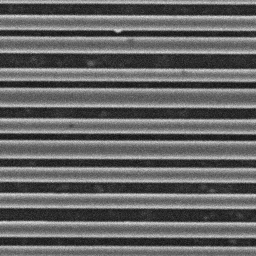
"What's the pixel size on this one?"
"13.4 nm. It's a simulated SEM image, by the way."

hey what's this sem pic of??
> parallel lines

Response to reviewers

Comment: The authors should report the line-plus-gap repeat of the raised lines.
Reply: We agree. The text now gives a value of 346 nm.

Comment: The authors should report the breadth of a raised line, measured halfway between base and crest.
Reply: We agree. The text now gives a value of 0.2 micrometres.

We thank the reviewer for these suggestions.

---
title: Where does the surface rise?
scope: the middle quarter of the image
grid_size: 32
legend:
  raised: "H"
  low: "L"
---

LLLLLLLLLLLLLLLLLLLLLLLLLLLLLLLL
HHHHHHHHHHHHHHHHHHHHHHHHHHHHHHHH
HHHHHHHHHHHHHHHHHHHHHHHHHHHHHHHH
HHHHHHHHHHHHHHHHHHHHHHHHHHHHHHHH
LLLLLLLLLLLLLLLLLLLLLLLLLLLLLLLL
LLLLLLLLLLLLLLLLLLLLLLLLLLLLLLLL
HHHHHHHHHHHHHHHHHHHHHHHHHHHHHHHH
HHHHHHHHHHHHHHHHHHHHHHHHHHHHHHHH
HHHHHHHHHHHHHHHHHHHHHHHHHHHHHHHH
HHHHHHHHHHHHHHHHHHHHHHHHHHHHHHHH
HHHHHHHHHHHHHHHHHHHHHHHHHHHHHHHH
LLLLLLLLLLLLLLLLLLLLLLLLLLLLLLLL
LLLLLLLLLLLLLLLLLLLLLLLLLLLLLLLL
LLLLLLLLLLLLLLLLLLLLLLLLLLLLLLLL
HHHHHHHHHHHHHHHHHHHHHHHHHHHHHHHH
HHHHHHHHHHHHHHHHHHHHHHHHHHHHHHHH
HHHHHHHHHHHHHHHHHHHHHHHHHHHHHHHH
LLLLLLLLLLLLLLLLLLLLLLLLLLLLLLLL
LLLLLLLLLLLLLLLLLLLLLLLLLLLLLLLL
HHHHHHHHHHHHHHHHHHHHHHHHHHHHHHHH
HHHHHHHHHHHHHHHHHHHHHHHHHHHHHHHH
HHHHHHHHHHHHHHHHHHHHHHHHHHHHHHHH
HHHHHHHHHHHHHHHHHHHHHHHHHHHHHHHH
LLLLLLHHHHHHHHHHHHHHHHHHHHHHHHHH
LLLLLLLLLLLLLLLLLLLLLLLLLLLLLLLL
LLLLLLLLLLLLLLLLLLLLLLLLLLLLLLLL
HHHHHHHHHHHHHHHHHHHHHHHHHHHHHHHH
HHHHHHHHHHHHHHHHHHHHHHHHHHHHHHHH
HHHHHHHHHHHHHHHHHHHHHHHHHHHHHHHH
LLLLLLLLLLLLLLLLLLLLLLLLLLLLLLLL
LLLLLLLLLLLLLLLLLLLLLLLLLLLLLLLL
LLLLLLLLLLLLLLLLLLLLLLLLLLLLLLLL